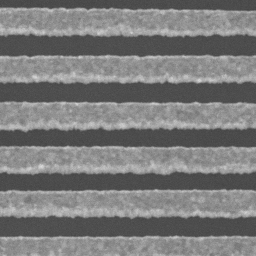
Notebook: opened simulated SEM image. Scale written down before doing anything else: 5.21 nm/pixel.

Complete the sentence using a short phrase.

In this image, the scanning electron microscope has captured lines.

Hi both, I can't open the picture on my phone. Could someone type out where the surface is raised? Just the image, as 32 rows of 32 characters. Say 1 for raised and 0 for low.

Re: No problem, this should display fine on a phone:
00000000000000000000000000000000
11111111111111111111111111111111
11111111111111111111111111111111
11111111111111111111111111111111
00000000000000000000000000000000
00000000000000000000000000000000
00000000000000000000000000000000
11111111111111111111111111111111
11111111111111111111111111111111
11111111111111111111111111111111
00000000000000000000000000000000
00000000000000000000000000000000
00000000000000000000000000000000
11111111111111111111111111111111
11111111111111111111111111111111
11111111111111111111111111111111
00000000000000000000000000000000
00000000000000000000000000000000
11111111111111111111111111111111
11111111111111111111111111111111
11111111111111111111111111111111
01111000100100000100100000000000
00000000000000000000000000000000
00000000000000000000000000000000
11111111111111111111111111111111
11111111111111111111111111111111
11111111111111111111111111111111
00000000000000000000000000000000
00000000000000000000000000000000
00000000000000000000000000000000
11111111111111111111111111111111
11111111111111111111111111111111